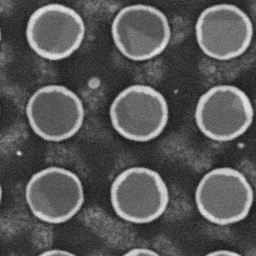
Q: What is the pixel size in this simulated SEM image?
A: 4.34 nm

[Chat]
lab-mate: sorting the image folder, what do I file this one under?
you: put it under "a regular array of raised bodies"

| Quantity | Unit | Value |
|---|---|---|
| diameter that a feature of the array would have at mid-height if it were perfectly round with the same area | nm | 233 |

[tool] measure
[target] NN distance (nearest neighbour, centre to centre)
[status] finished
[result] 353 nm